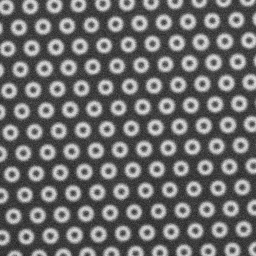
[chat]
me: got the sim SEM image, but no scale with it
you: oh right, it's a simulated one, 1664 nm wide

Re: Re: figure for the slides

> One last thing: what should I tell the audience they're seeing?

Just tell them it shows an array of small figures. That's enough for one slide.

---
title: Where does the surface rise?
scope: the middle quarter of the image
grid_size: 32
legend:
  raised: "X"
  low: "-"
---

XXX--XXXX--XXXX--XXXX---XXX---XX
XXX--XXXX---XXX---XXX---XXX---XX
XX-----X------------------------
----------------------------XX--
---XX----XXX---XXX---XXX---XXX--
--XXXX---XXX---XXX---XXX---XXX--
--XXXX---XXX---XXX---XXX---XXX--
---XXX----X---------------------
-------------------------------X
-X-----XX---XXX---XXX---XXX---XX
XXX---XXX---XXX---XXX---XXXX--XX
XXX---XXX---XXX---XXX---XXX---XX
XXX---XXX---XXX----X------------
--------------------------------
----------X-----XX---XXX---XXX--
---XXX---XXXX--XXXX--XXXX--XXXX-
X--XXXX--XXXX--XXXX--XXXX--XXXX-
---XXX---XXX---XXX----XX----XX--
--------------------------------
-------------------XX----XX----X
XXX---XXXX--XXXX--XXXX--XXXX--XX
XXXX--XXXX--XXXX--XXXX--XXXX--XX
XXXX--XXXX--XXXX--XXXX---XX----X
-XX----XX-----------------------
----------------------XX----XX--
----XX----XXX---XXX--XXXX---XXX-
X--XXXX--XXXX--XXXX--XXXX--XXXX-
X--XXXX--XXXX--XXXX---XXX---XX--
X---XX----XX--------------------
--------------------------------
--X----XX----XXX---XXX---XXX---X
-XXX--XXXX--XXXX---XXX---XXX---X